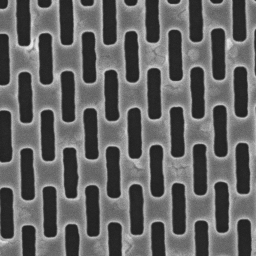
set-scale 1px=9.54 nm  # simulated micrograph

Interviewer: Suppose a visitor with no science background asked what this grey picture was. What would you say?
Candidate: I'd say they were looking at a regular array of holes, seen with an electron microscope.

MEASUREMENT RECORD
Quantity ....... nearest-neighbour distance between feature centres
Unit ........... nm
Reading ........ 410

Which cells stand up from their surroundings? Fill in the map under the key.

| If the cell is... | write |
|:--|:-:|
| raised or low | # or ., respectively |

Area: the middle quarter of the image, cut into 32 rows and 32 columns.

#####...#######....#######....##
#####...###.###....##...##....##
...##...##...##....##...##....#.
...##...##....#....##...##....#.
...##...##....##..###...########
...#######....#######...########
...#######....#######...########
...#######....#######...########
...#######....#######...########
...#######....#######...########
...#######....#######...########
...##...##....##...##....##...##
...##...##....##...##....#....##
...##...##....##...##...###...##
..###...########...########...##
#####....#######...########...##
#####....#######...########...##
#####...########...########...##
#####....#######...########...##
#####....#######....#######...##
#####....#######....##..###...##
...##....##...##....#....##...##
...##....#....##...##....##...##
...##...##....###..##....#######
...#######....#######....#######
...#######....#######....#######
...########...#######....#######
...########...########...#######
....#######...#######....#######
...########...#######....#######
...###..###...###..###...##...##
...##....##...##....##...##...##